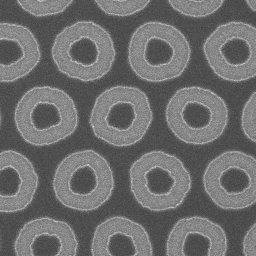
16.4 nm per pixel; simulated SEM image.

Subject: ring-shaped grooves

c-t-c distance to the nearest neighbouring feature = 74.6 px